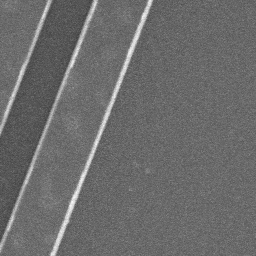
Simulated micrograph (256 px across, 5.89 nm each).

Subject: one or a few lines or trenches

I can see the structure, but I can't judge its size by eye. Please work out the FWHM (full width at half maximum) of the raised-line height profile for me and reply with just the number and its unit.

0.309 um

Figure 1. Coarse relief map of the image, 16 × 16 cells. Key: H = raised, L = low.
HHHLLLHHHLLLLLLL
HHHLLHHHHLLLLLLL
HHLLLHHHLLLLLLLL
HHLLLHHHLLLLLLLL
HLLLHHHHLLLLLLLL
HLLLHHHLLLLLLLLL
HLLHHHHLLLLLLLLL
LLLHHHHLLLLLLLLL
LLLHHHLLLLLLLLLL
LLHHHHLLLLLLLLLL
LLHHHLLLLLLLLLLL
LLHHHLLLLLLLLLLL
LHHHHLLLLLLLLLLL
LHHHLLLLLLLLLLLL
HHHHLLLLLLLLLLLL
HHHHLLLLLLLLLLLL